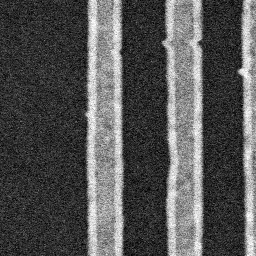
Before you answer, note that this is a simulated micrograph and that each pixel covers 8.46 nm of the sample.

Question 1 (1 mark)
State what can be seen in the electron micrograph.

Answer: one or a few lines or trenches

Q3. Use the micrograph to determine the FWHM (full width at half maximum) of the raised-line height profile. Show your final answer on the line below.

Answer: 0.211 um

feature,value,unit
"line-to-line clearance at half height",0.453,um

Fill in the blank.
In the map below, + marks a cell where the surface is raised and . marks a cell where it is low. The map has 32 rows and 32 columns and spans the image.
............+++......++++......+
............+++......++++......+
............+++......++++......+
............+++......++++......+
............+++......++++......+
............+++......+++.......+
............++.......++++......+
............+++......++++......+
............+++......++++......+
............+++.......+++......+
............+++.......+++......+
............+++.......+++......+
............+++.......+++......+
............+++.......+++......+
...........++++.......+++......+
............+++.......+++......+
...........++++.......+++......+
...........++++.......+++......+
...........++++.......+++......+
............+++.......+++......+
............+++.......+++......+
............+++.......+++......+
............+++.......+++......+
............+++.......+++......+
............+++......++++......+
............+++......++++......+
............+++......++++......+
............+++......++++......+
............+++.......+++......+
............+++.......+++......+
............+++.......+++......+
............+++.......+++......+